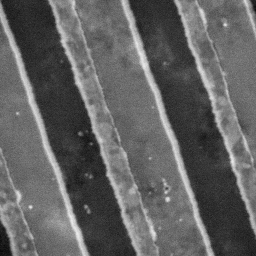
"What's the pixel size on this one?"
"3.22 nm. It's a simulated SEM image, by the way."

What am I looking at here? lines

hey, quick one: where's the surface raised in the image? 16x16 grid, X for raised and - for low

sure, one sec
---XXXXX---XXXXX
----XXXX----XXXX
X---XXXXX---XXXX
X---XXXXX---XXXX
X----XXXX----XXX
XX---XXXXX---XXX
XX---XXXXX---XXX
XX----XXXX----XX
XXX---XXXXX---XX
XXX---XXXXX---XX
XXX----XXXX----X
XXXX---XXXXX---X
XXXX----XXXX---X
XXXX----XXXX----
-XXXX---XXXXX---
-XXXX----XXXX---